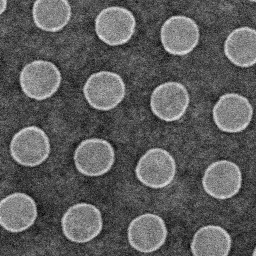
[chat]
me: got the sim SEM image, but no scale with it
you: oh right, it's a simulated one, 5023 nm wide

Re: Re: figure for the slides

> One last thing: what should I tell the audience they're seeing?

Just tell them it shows a regular array of raised bodies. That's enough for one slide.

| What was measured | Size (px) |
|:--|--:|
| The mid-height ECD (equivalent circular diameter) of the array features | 38.3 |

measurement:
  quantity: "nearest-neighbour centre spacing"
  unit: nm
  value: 1270